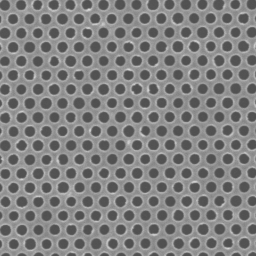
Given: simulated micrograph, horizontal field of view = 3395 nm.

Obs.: a regular array of holes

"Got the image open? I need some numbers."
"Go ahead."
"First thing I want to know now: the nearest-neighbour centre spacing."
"212 nm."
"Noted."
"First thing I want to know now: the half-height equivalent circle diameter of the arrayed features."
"140 nm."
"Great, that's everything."